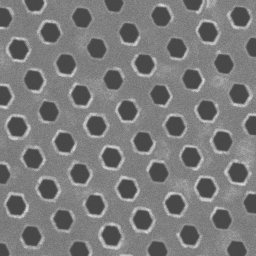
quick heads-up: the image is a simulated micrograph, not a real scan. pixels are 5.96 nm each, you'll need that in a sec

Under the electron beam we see a regular array of holes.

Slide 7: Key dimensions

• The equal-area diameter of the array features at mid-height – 114 nanometers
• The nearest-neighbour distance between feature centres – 34.5 pixels